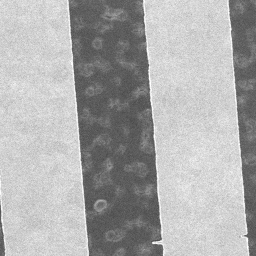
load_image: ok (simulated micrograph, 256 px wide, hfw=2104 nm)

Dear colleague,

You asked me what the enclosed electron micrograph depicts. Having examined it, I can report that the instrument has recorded one or a few lines or trenches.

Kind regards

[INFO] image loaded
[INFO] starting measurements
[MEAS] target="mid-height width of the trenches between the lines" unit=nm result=620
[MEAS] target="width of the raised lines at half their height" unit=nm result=692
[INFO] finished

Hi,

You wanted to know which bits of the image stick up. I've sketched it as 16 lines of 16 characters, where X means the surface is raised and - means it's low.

XXXX-----XXXXX--
XXXX-----XXXXX--
XXXX-----XXXXX--
XXXXX----XXXXXX-
XXXXX----XXXXXX-
XXXXX----XXXXXX-
XXXXX----XXXXXX-
XXXXX-----XXXXX-
XXXXX-----XXXXX-
XXXXX-----XXXXX-
XXXXX-----XXXXX-
XXXXX-----XXXXX-
XXXXX-----XXXXX-
XXXXX-----XXXXX-
XXXXX-----XXXXX-
XXXXXX----XXXXXX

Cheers